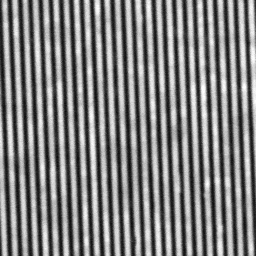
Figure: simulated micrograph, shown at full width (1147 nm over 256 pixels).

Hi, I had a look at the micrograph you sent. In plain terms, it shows parallel lines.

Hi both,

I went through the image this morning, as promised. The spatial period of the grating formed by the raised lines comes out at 45.9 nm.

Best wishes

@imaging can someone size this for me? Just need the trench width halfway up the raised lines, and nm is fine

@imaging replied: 26.9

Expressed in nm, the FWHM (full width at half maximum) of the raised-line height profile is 19.6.